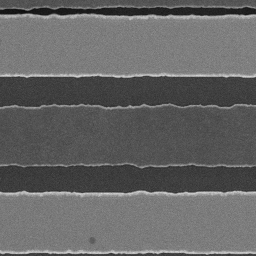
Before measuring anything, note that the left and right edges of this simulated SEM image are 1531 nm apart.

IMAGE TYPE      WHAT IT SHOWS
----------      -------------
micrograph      lines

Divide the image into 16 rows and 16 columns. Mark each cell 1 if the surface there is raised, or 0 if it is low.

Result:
1111111111111111
1111111111111111
1111111111111111
1111111111111111
1111111111111111
0000000000000000
0000000000000000
1111111111111111
1111111111111111
1111111111111111
0000000000000000
0000000000000000
1111111111111111
1111111111111111
1111111111111111
1111111111111111